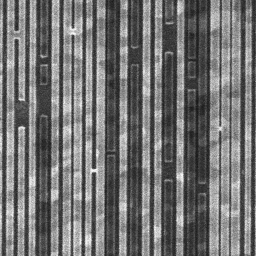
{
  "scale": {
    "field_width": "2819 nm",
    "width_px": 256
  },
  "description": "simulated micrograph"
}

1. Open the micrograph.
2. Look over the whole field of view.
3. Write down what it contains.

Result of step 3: parallel lines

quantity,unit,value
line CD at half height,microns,0.0771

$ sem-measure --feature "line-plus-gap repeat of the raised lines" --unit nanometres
125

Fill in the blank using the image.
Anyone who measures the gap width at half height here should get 0.0482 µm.